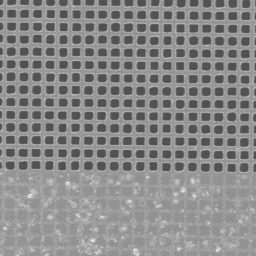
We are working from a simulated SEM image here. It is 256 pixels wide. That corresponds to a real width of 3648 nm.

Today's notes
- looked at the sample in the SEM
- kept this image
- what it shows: a regular array of holes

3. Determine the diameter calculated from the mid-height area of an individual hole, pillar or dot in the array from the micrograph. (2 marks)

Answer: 138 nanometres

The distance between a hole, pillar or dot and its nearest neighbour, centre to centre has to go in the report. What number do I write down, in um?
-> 0.177